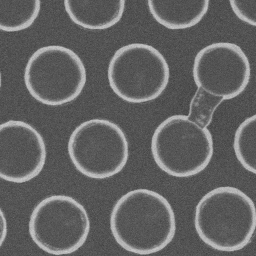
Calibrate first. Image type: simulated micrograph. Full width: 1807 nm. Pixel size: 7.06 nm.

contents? raised bodies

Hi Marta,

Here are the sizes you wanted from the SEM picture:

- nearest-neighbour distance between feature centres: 588 nm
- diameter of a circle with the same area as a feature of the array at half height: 399 nm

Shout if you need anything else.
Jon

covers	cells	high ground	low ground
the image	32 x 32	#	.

#####...#######....#######...###
####.....######....#######....##
####.....######.....#####......#
##..............................
................................
................................
.....####......####......#####..
....######....######.....######.
...#######....#######...#######.
...#######....#######...#######.
....######....#######....#####..
....######.....#####.....#####..
.....####.......###.....####....
........................###.....
.......................###......
.##........###......######....##
####.....######.....######....##
#####....#######...#######....##
#####....#######...#######....##
#####....#######...#######....##
#####.....#####.....######.....#
####.......###.......###........
................................
................................
................####......#####.
.....#####.....######....######.
....#######...#######....#######
#...#######...#######....#######
#...#######...########...#######
....#######....######....######.
.....#####.....######.....####..
......##........................